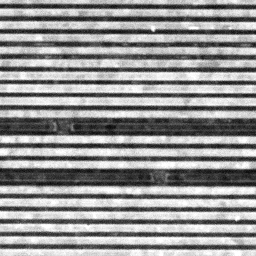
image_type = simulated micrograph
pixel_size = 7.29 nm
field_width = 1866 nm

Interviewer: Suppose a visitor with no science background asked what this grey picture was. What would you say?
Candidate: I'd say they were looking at parallel lines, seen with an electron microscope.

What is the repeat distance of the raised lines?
92.4 nm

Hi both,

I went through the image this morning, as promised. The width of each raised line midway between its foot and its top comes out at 49.2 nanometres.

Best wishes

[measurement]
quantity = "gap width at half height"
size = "42.8 nm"